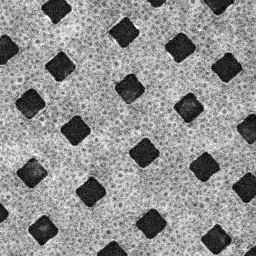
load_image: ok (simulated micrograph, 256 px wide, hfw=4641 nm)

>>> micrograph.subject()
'a regular array of holes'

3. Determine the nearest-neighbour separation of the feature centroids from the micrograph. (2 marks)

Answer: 1030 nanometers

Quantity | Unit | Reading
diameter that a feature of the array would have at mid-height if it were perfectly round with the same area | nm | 512